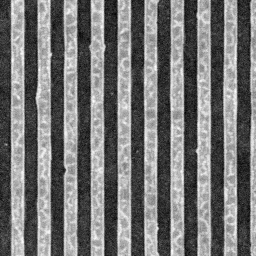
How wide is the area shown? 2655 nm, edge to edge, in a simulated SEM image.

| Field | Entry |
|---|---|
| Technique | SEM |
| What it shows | parallel lines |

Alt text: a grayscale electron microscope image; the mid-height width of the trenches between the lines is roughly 0.156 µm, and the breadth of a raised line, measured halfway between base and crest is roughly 122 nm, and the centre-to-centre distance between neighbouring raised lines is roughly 276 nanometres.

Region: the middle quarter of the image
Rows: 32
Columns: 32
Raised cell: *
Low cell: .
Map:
.**....***....**....***....***..
***....***....**....***....**...
***....**.....**....***....***..
***....**.....**....***....***..
***....**.....**....***....***..
***....**.....**....***....***..
***....**.....**....***....***..
***....***....**....***....***..
***....***....**....***....***..
***....***....**....***....***..
***....***....**....***....***..
***....***....**....***....***..
***....***....**....***....***..
***....***....**....***....***..
***....***....**....***....***..
***....***....**....***....***..
***....***....**....***....***..
***....***....**....***....***..
***....***....**....***....***..
***....***....**....***....***..
***....***....**....***....***..
***....***....**....***....***..
***....***....**....***....***..
***....***....**....***....***..
***....***....**....***....***..
***....***....**....***....***..
.**....***....**....***....***..
***....***....**....***....***..
***....***....**....***....***..
***....***....**....***....***..
***....***....**....***....***..
***....***....**....***....***..